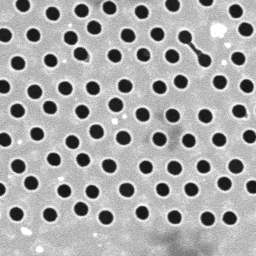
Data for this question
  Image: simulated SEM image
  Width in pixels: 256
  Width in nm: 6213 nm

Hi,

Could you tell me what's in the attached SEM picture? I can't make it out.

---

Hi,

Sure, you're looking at a regular array of holes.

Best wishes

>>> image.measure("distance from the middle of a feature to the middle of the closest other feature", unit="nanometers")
611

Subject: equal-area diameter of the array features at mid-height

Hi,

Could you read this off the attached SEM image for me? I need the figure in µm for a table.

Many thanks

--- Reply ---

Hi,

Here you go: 0.36